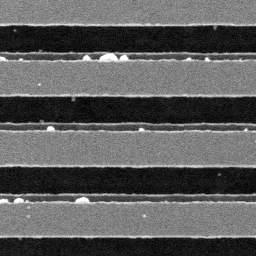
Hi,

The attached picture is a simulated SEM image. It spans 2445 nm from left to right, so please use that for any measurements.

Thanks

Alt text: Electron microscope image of lines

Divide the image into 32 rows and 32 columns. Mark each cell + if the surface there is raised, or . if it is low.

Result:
++++++++++++++++++++++++++++++++
++++++++++++++++++++++++++++++++
++++++++++++++++++++++++++++++++
................................
................................
................................
................................
++++++++++++++++++++++++++++++++
++++++++++++++++++++++++++++++++
++++++++++++++++++++++++++++++++
++++++++++++++++++++++++++++++++
++++++++++++++++++++++++++++++++
................................
................................
................................
+++++++++++++.+++++......++.++..
++++++++++++++++++++++++++++++++
++++++++++++++++++++++++++++++++
++++++++++++++++++++++++++++++++
++++++++++++++++++++++++++++++++
++++++++++++++++++++++++++++++++
................................
................................
................................
++++++++++++++++++++++++++++++++
++++++++++++++++++++++++++++++++
++++++++++++++++++++++++++++++++
++++++++++++++++++++++++++++++++
++++++++++++++++++++++++++++++++
++++++++++++++++++++++++++++++++
................................
................................